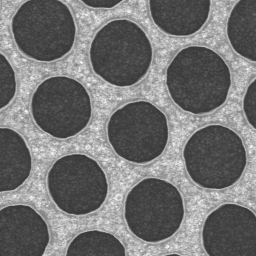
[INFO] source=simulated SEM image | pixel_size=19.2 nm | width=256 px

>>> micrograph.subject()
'holes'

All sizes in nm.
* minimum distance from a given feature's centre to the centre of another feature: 1530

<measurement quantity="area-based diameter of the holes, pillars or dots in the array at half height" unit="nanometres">1180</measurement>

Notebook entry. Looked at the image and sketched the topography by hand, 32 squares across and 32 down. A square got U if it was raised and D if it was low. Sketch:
UUUDDDDDUUUDDDDUUUUDDDDDDDUUUDDD
UUDDDDDDDUUUUUUUUUUDDDDDDDUUUDDD
UUDDDDDDDUUUUUUDUUUDDDDDDDUUUDDD
UUDDDDDDDUUUUDDDDDUUDDDDDUUUDDDD
UUDDDDDDDUUUDDDDDDUUUUUUUUUUDDDD
UUDDDDDDDUUDDDDDDDDUUUUUUUUUUDDD
UUUDDDDDUUUDDDDDDDDUUUDDDDDUUUDD
DUUUUDDUUUUDDDDDDDDUUUDDDDDDUUUD
DUUUUUUUUUUUDDDDDDDUUDDDDDDDDUUU
DDUUUUUUUUUUDDDDDDUUUDDDDDDDDUUU
DDUUUDDDDDUUUUDDDUUUUDDDDDDDDUUD
DDUUDDDDDDDUUUUUUUUUUDDDDDDDDUUD
DUUUDDDDDDDUUUUUUUUUUUDDDDDDUUDD
UUUUDDDDDDDUUUUDDDDDUUUDDDDUUUDD
UUUUDDDDDDDUUUDDDDDDDUUUUUUUUUUD
UUUUUDDDDDDUUUDDDDDDDUUUUUUUUUUD
DDUUUUDDDDUUUDDDDDDDDUUUUDDDDUUU
DDDUUUUUUUUUUUDDDDDDDUUUDDDDDDUU
DDDUUUUUUUUUUUDDDDDDDUUDDDDDDDDU
DDDDUUUUDDDUUUUDDDDDUUUDDDDDDDDU
DDDDUUUDDDDDUUUUUUUUUUUDDDDDDDDU
DDDDUUDDDDDDDUUUUUUUUUUDDDDDDDUU
DDDUUUDDDDDDDUUUUUDDUUUUDDDDDDUU
DDUUUUDDDDDDDUUUUDDDDDUUUUDDUUUU
UUUUUUDDDDDDDUUUDDDDDDDUUUUUUUUU
UUUUUUUDDDDDDUUUDDDDDDDUUUUUDUUU
DDDDDUUUDDDUUUUUDDDDDDDUUUUDDDDU
DDDDDUUUUUUUUUUUDDDDDDDUUUDDDDDD
DDDDDDUUUUUUUUUUDDDDDDUUUDDDDDDD
DDDDDDUUUUDDDDUUUDDDDUUUUDDDDDDD
DDDDDDUUUDDDDDDUUUUUUUUUUDDDDDDD
DDDDDUUUDDDDDDDDUUUUUUUUUUDDDDDD